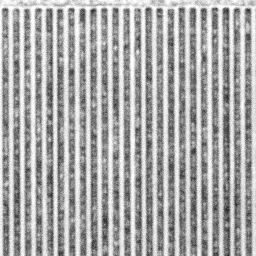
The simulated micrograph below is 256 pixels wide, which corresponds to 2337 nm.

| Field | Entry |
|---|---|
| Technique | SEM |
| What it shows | parallel lines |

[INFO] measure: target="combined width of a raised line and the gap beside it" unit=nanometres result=101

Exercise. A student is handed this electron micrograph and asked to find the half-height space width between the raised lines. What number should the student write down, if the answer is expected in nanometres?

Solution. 73.1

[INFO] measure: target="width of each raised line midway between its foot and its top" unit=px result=2.63